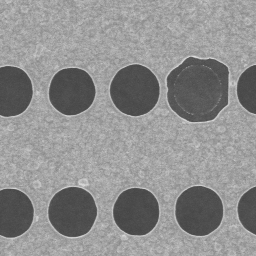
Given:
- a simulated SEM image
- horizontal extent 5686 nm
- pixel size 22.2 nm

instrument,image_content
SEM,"holes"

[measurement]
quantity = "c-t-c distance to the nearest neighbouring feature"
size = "1.4 µm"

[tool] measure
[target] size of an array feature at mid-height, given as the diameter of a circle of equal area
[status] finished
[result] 1.1 µm